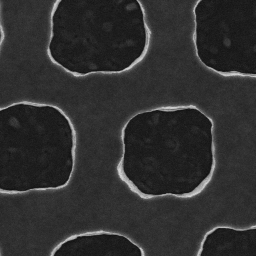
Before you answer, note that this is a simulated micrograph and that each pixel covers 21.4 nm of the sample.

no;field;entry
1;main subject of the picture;holes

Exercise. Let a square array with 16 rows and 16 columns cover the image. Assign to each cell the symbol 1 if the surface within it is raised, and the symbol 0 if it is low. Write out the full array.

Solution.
1110000001110000
1110000001110000
1110000001110000
1110000001110000
1111101111111100
1111111111111111
1011111111111111
0000111100000111
0000011100000111
0000011100000111
0000011100000111
0000111100000111
1111111111111111
1111111111111111
1111111111111000
1111000001111000